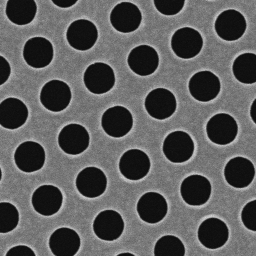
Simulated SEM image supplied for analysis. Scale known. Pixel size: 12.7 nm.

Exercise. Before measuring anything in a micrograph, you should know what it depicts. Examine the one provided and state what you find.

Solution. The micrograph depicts a regular array of holes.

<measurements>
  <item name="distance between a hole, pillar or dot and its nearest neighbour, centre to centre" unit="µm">0.591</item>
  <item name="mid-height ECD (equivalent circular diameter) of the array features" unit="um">0.4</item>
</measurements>